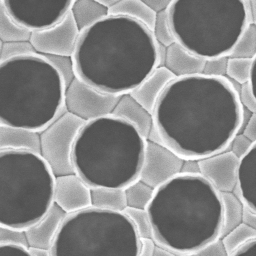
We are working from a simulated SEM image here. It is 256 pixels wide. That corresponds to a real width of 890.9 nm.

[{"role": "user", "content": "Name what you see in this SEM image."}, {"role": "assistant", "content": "holes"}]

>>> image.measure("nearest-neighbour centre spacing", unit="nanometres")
337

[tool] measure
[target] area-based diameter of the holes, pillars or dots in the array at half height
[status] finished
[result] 257 nanometres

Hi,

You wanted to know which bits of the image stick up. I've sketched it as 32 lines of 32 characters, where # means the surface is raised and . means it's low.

#........#############........##
#.......#############..........#
##.....######....####..........#
###########.......####........##
##########.........###........##
##########.........####......###
##########.........#####....####
#....#####.........#############
.......###.........############.
.......###........#############.
........###......#####......####
........############.........###
.......#############.........###
.......#############..........##
.......#############..........##
#.....#####.....####..........##
##########.......###.........###
##########........###.......####
#########.........####.....#####
....#####.........#############.
.....#####........############..
......####.......#############..
.......####.....######....####..
.......#############......####..
......#############........###..
......#############.........###.
......####....#####.........####
.....###........###.........####
########.........##........#####
#######..........###.......#####
#######..........####.....#####.
...####..........#############..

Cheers